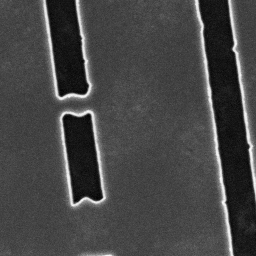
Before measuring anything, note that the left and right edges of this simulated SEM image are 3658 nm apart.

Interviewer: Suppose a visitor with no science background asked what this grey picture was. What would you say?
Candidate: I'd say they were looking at one or a few lines or trenches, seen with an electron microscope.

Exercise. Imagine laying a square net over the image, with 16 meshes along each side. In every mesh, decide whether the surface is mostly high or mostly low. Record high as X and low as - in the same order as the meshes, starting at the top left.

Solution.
XXX--XXXXXXX--XX
XXX--XXXXXXXX--X
XXX--XXXXXXXX--X
XXX--XXXXXXXX--X
XXX--XXXXXXXX--X
XXXX--XXXXXXX--X
XXXXXXXXXXXXX--X
XXXX--XXXXXXX--X
XXXX--XXXXXXX--X
XXXX--XXXXXXXX--
XXXX--XXXXXXXX--
XXXX--XXXXXXXX--
XXXXXXXXXXXXXX--
XXXXXXXXXXXXXX--
XXXXXXXXXXXXXX--
XXXXXXXXXXXXXX--